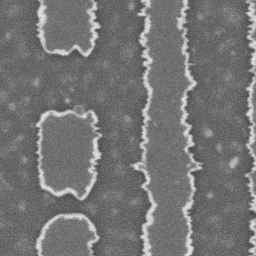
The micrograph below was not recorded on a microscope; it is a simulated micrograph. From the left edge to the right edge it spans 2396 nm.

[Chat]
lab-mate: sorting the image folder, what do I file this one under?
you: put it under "one or a few lines or trenches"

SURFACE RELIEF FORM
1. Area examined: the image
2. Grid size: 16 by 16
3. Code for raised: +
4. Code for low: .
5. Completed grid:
...+++...+++....
..++++...+++....
...+++...+++....
.........+++....
.........+++....
.........+++....
.........+++....
...+++...+++....
...+++...+++....
..++++...+++....
..++++...+++....
...+++...+++....
.........+++....
....+....+++....
...+++...+++....
..++++...+++....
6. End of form